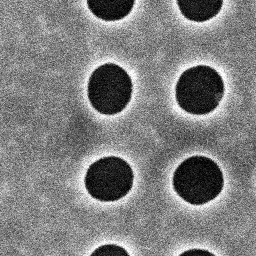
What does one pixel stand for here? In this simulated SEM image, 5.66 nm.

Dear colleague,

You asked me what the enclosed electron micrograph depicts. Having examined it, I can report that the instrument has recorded holes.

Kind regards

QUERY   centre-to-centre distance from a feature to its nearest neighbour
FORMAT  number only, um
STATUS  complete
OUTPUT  0.506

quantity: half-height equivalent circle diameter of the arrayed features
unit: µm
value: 0.28